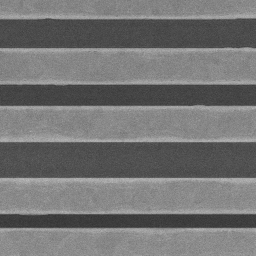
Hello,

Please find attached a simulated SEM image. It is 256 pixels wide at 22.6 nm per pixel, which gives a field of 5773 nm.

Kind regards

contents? lines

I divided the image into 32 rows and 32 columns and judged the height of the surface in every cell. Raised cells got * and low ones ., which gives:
********************************
********************************
................................
................................
................................
................................
********************************
********************************
********************************
********************************
................................
................................
................................
********************************
********************************
********************************
********************************
********************************
................................
................................
................................
................................
********************************
********************************
********************************
********************************
********************************
................................
................................
********************************
********************************
********************************